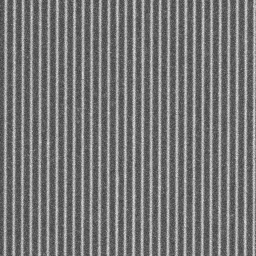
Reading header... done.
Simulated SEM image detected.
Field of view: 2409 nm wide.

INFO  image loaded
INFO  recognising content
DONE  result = parallel lines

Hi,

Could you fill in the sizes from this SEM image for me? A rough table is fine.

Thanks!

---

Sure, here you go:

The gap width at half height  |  6.88 px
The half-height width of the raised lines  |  1.88 px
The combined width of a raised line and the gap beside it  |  0.0807 microns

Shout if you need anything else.